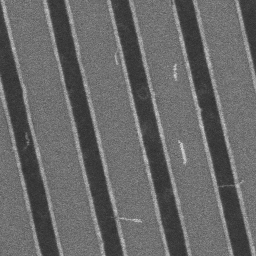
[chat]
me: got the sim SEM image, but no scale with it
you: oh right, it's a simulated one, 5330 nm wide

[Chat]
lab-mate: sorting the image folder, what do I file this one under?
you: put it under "one or a few lines or trenches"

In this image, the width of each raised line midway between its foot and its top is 0.446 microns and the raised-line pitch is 1300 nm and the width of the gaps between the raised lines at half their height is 0.854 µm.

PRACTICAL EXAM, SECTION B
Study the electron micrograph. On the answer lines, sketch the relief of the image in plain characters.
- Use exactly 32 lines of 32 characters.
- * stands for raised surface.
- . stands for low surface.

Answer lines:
......**......**......**......**
*.....***.....***.....***.....**
*.....***.....***.....***.....**
*.....***.....***.....***.....**
*......**......**......**......*
**.....**......***.....***.....*
**.....***.....***.....***.....*
**.....***.....***.....***.....*
**......**......**.....***.....*
**......**......***.....***.....
***.....***.....***.....***.....
***.....***.....***.....***.....
***.....***.....***.....***.....
.**......**......**......**.....
.***.....***.....***.....***....
.***.....***.....***.....***....
.***.....***.....***.....***....
..**......**......**......**....
..***.....***.....***.....***...
..***.....***.....***.....***...
..***.....***.....***.....***...
...**.....***......**......**...
...***.....***.....***.....***..
...***.....***.....***.....***..
...***.....***.....***.....***..
...***.....***.....***.....***..
....**......**......**......**..
....***.....***.....***.....***.
....***.....***.....***.....***.
....***.....***.....***.....***.
.....**......**......**......**.
.....***.....***.....***.....***